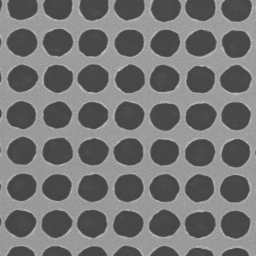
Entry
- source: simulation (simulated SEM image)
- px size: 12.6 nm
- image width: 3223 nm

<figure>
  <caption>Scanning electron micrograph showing a regular array of holes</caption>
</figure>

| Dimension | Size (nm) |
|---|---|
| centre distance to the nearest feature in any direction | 445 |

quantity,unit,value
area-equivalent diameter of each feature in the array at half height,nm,360